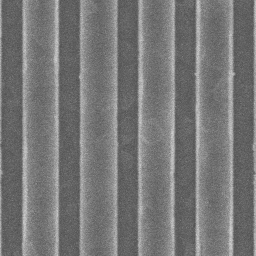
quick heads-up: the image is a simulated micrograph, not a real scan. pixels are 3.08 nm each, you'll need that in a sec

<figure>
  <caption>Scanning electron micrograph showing parallel lines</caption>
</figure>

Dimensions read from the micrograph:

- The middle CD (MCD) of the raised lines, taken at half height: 112 nanometres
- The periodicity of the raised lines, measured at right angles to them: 178 nanometers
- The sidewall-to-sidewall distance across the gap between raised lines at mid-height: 65.8 nm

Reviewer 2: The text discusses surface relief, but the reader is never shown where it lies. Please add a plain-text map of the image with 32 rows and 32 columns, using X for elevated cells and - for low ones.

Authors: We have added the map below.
---XXXX---XXXXX--XXXXX---XXXX---
---XXXX---XXXXX--XXXXX---XXXX---
---XXXX---XXXXX--XXXXX---XXXX---
---XXXX---XXXXX--XXXXX---XXXX---
---XXXX---XXXXX--XXXXX---XXXX---
---XXXX---XXXXX--XXXXX---XXXX---
---XXXX---XXXXX--XXXXX---XXXX---
---XXXX---XXXXX--XXXXX---XXXX---
---XXXX---XXXXX--XXXXX---XXXX---
---XXXX---XXXXX--XXXXX--XXXXX---
---XXXX---XXXXX--XXXXX---XXXX---
---XXXX---XXXXX--XXXXX---XXXX---
---XXXX---XXXXX--XXXXX---XXXX---
---XXXX---XXXXX--XXXXX---XXXX---
---XXXX---XXXXX--XXXXX---XXXX---
---XXXX---XXXXX--XXXXX---XXXX---
---XXXX---XXXXX--XXXXX---XXXX---
---XXXX---XXXXX--XXXXX---XXXX---
---XXXX---XXXXX--XXXXX---XXXX---
---XXXX---XXXXX--XXXXX---XXXX---
---XXXX---XXXXX--XXXXX---XXXX---
---XXXX---XXXXX--XXXXX---XXXX---
---XXXX---XXXXX--XXXXX---XXXX---
---XXXX---XXXXX--XXXXX---XXXX---
---XXXX---XXXXX--XXXXX---XXXX---
---XXXX---XXXXX--XXXXX---XXXX---
---XXXX---XXXXX--XXXXX---XXXX---
---XXXX---XXXXX--XXXXX---XXXX---
---XXXX---XXXXX--XXXXX---XXXX---
---XXXX---XXXXX--XXXXX---XXXX---
---XXXX---XXXXX--XXXXX---XXXX---
---XXXX---XXXXX--XXXXX---XXXX---